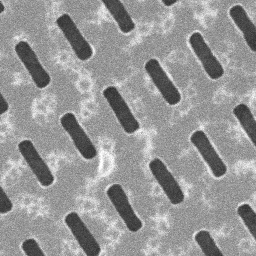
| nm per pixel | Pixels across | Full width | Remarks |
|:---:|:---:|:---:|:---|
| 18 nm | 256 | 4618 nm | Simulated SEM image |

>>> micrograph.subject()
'a regular array of holes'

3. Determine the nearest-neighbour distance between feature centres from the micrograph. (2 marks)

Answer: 0.903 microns